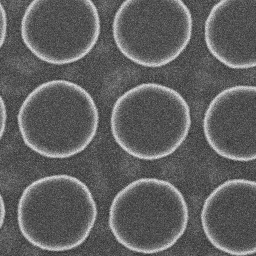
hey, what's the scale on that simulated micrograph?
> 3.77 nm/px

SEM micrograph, raised bodies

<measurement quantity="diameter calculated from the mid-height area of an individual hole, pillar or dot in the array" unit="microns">0.282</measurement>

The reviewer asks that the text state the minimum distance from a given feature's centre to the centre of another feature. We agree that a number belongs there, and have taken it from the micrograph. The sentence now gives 0.347 µm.